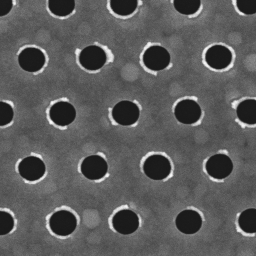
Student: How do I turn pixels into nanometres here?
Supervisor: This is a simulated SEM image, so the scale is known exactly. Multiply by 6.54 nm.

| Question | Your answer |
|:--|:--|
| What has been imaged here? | a regular array of holes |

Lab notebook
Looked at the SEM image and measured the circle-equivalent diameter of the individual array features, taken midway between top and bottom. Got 0.169 micrometres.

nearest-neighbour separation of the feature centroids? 407 nm